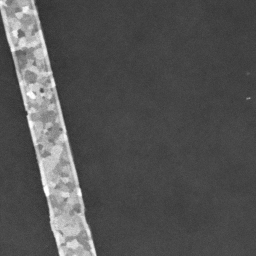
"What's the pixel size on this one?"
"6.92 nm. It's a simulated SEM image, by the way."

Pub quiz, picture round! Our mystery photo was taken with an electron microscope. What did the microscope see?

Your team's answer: one or a few lines or trenches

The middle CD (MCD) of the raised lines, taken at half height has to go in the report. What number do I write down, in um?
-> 0.22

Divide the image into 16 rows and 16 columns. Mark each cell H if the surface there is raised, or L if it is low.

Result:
HHLLLLLLLLLLLLLL
HHLLLLLLLLLLLLLL
LHHLLLLLLLLLLLLL
LHHLLLLLLLLLLLLL
LHHLLLLLLLLLLLLL
LHHLLLLLLLLLLLLL
LLHHLLLLLLLLLLLL
LLHHLLLLLLLLLLLL
LLHHLLLLLLLLLLLL
LLHHLLLLLLLLLLLL
LLLHHLLLLLLLLLLL
LLLHHLLLLLLLLLLL
LLLHHLLLLLLLLLLL
LLLHHLLLLLLLLLLL
LLLHHHLLLLLLLLLL
LLLLHHLLLLLLLLLL